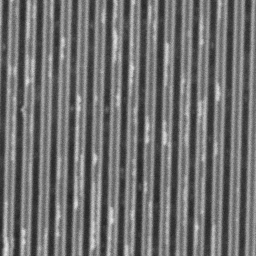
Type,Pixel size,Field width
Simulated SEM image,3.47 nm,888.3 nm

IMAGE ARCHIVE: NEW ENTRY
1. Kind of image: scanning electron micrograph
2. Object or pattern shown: parallel lines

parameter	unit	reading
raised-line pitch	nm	60.1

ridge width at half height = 27.3 nm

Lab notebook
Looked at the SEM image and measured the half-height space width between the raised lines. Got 0.0308 microns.